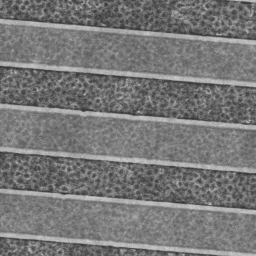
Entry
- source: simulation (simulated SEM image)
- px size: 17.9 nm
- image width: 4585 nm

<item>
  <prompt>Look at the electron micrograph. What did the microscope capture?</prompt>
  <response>one or a few lines or trenches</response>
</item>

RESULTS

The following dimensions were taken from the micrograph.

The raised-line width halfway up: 760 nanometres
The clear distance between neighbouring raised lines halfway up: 745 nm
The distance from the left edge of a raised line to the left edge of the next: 1520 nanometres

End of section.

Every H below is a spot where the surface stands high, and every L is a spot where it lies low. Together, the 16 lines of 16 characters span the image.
LLLLLLLLLLLLLLLL
HHLLLLLLLLLLLLLL
HHHHHHHHHHHHHHLL
HHHHHHHHHHHHHHHH
LLLLLLHHHHHHHHHH
LLLLLLLLLLLLLLLL
LLLLLLLLLLLLLLLL
HHHHHHHHHHHLLLLL
HHHHHHHHHHHHHHHH
LLHHHHHHHHHHHHHH
LLLLLLLLLLLLLHHH
LLLLLLLLLLLLLLLL
HHHHHHHLLLLLLLLL
HHHHHHHHHHHHHHHH
HHHHHHHHHHHHHHHH
LLLLLLLLLLHHHHHH